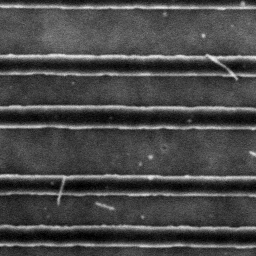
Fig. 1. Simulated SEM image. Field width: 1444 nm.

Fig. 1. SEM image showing lines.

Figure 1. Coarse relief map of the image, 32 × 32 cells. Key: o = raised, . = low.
oooooooooooooooooooooooooooooooo
................................
................................
................................
................................
................................
................................
oooooooooooooooooooooooooooooooo
oooooooooooooooooooooooooooooooo
.............................o..
................................
................................
................................
oooooooooooooooooo.oooo.oooo....
oooooooooooooooooooooooooooooooo
oooooooooooooooooooooooooooooooo
................................
................................
................................
................................
................................
................................
oooooooooooooooooooooooooooooooo
oooooooooooooooooooooooooooooooo
...............................o
................................
................................
................................
ooooooooooooooooooooooooooooo.oo
oooooooooooooooooooooooooooooooo
oooooooooooooooooooooooooooooooo
................................